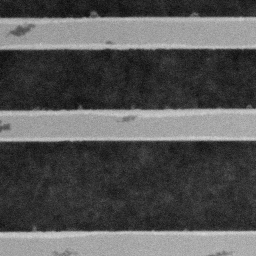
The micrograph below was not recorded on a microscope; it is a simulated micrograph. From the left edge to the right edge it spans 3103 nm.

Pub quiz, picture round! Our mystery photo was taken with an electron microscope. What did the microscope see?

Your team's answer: lines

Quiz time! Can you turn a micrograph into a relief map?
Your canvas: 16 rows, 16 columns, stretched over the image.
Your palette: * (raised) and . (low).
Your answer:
................
****************
****************
................
................
................
................
****************
****************
................
................
................
................
................
.......**.....**
****************